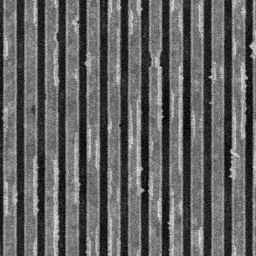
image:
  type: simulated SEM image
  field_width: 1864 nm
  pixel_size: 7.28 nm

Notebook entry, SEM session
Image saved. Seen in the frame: parallel lines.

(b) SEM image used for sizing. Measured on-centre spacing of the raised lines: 151 nanometres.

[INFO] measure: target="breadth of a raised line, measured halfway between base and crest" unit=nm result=85.6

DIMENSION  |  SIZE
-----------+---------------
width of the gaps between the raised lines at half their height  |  67.4 nm